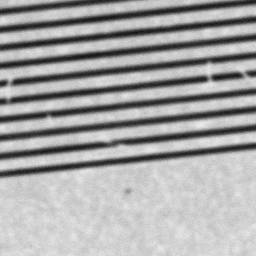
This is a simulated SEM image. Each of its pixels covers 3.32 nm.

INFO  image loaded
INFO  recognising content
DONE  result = parallel lines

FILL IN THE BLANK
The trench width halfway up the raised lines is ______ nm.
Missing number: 24.3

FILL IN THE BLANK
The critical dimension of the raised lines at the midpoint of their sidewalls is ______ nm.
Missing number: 36.7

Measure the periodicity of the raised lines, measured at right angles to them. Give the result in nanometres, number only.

59.6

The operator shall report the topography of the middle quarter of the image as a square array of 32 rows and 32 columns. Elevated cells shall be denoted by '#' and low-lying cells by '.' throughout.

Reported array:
################................
#####...................########
..............##################
.....########################...
####################............
###########..................###
##..................############
...........#####################
..######################........
###############.................
######..................########
...............#################
......########################..
#####################...........
############..................##
###..................###########
............####################
...#####################........
###############.................
######...................#######
..............##################
.......#######################..
#####################...........
############..................##
###..................###########
............####################
...#############################
################################
################################
################################
################################
################################